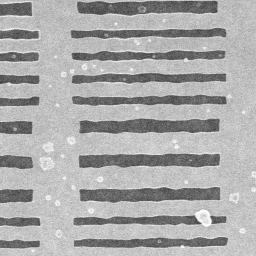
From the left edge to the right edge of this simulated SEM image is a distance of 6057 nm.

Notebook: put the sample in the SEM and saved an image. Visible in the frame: groups of lines, slits or small figures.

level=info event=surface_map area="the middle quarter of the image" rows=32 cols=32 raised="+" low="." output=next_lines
++++++++++++++++++++++++++++++++
++++++++++++++++++++++++++++++++
+++++++++.......++..............
++..............................
++..............................
++++++++++++++++++++++++++++++++
++++++++++++++++++++++++++++++++
++++++++++++++++++++++++++++++++
++..............................
++..............................
+++++++.+++.++++++++++++++++++++
++++++++++++++++++++++++++++++++
++++++++++++++++++++++++++++++++
+++++++++++++++++++..+++++++++++
++++............................
++++............................
++++............................
++++.+++++++.+++++++++++++++++++
++++++++++++++++++++++++++++++++
++++++++++++++++++++++++++++++++
++++++++++++++++++++++++++++++++
++++++++++++++++++++++++++++++++
++++++++++.++.........+++.......
++++............................
++++............................
++++............................
++++++++++++++++++++++++++++++++
++++++++++++++++++++++++++++++++
++++++++++++++++++++++++++++++++
++++++++++++++++++++++++++++++++
++++++++++++++++++++++++++++++++
++++............................